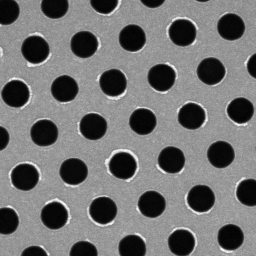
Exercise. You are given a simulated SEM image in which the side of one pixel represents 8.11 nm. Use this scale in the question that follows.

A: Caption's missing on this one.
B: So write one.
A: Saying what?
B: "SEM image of a regular array of holes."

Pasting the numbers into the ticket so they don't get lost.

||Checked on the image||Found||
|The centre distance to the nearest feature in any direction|0.39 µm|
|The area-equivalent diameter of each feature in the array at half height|215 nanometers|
